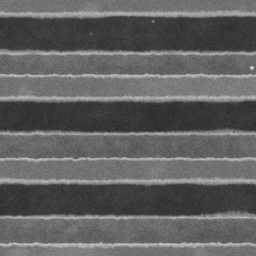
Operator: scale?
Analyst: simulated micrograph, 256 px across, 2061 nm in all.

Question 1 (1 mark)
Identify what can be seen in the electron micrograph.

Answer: lines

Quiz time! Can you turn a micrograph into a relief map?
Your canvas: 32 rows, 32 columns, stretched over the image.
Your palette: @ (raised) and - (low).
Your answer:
@@@@@@@@@@@@@@@@@@@@@@@@@@@@@@@@
@@@@@@@@@@@@@@@@@@@@@@@@@@@@@@@@
--------------------------------
--------------------------------
--------------------------------
--------------------------------
--------------------------------
@@@@@@@@@@@@@@@@@@@@@@@@@@@@@@@@
@@@@@@@@@@@@@@@@@@@@@@@@@@@@@@@@
@@@@@@@@@@@@@@@@@@@@@@@@@@@@@@@@
@@@@@@@@@@@@@@@@@@@@@@@@@@@@@@@@
@@@@@@@@@@@@@@@@@@@@@@@@@@@@@@@@
--------------------------------
--------------------------------
--------------------------------
--------------------------------
--------------------------------
@@@@@@@@@@@@@@@@@@@@@@@@@@@@@@@@
@@@@@@@@@@@@@@@@@@@@@@@@@@@@@@@@
@@@@@@@@@@@@@@@@@@@@@@@@@@@@@@@@
@@@@@@@@@@@@@@@@@@@@@@@@@@@@@@@@
@@@@@@@@@@@@@@@@@@@@@@@@@@@@@@@@
@@@@@@@@@@@@@@@@@@@@@@@@@@@@@@@@
--------------------------------
--------------------------------
--------------------------------
--------------------------------
@@@@@@@@@@@@@@@@@@@@@@@@@@@@@@@@
@@@@@@@@@@@@@@@@@@@@@@@@@@@@@@@@
@@@@@@@@@@@@@@@@@@@@@@@@@@@@@@@@
@@@@@@@@@@@@@@@@@@@@@@@@@@@@@@@@
@@@@@@@@@@@@@@@@@@@@@@@@@@@@@@@@